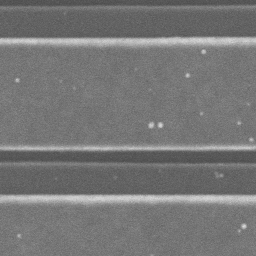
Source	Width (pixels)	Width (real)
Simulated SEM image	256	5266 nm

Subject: lines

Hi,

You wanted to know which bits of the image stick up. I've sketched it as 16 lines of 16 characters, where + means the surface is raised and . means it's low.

................
................
++++++++++++++++
++++++++++++++++
++++++++++++++++
++++++++++++++++
++++++++++++++++
++++++++++++++++
++++++++++++++++
................
................
................
++++++++++++++++
++++++++++++++++
++++++++++++++++
++++++++++++++++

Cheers